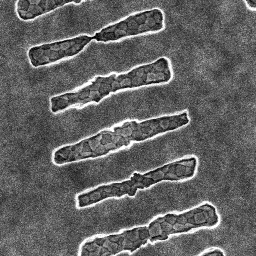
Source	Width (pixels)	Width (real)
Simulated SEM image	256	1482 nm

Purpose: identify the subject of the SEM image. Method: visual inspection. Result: holes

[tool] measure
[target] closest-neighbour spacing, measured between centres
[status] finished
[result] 0.288 micrometres